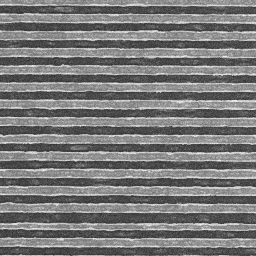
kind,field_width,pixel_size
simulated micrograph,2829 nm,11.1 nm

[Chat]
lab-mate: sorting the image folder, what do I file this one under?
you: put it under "parallel lines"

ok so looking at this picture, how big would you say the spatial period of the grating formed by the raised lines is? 190 nm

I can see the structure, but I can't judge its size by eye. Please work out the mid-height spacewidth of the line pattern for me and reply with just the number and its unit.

0.104 um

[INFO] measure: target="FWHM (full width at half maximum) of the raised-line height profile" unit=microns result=0.0856